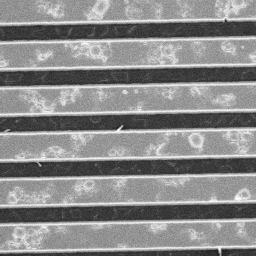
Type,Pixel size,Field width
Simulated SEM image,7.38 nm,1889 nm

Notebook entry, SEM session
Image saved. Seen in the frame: parallel lines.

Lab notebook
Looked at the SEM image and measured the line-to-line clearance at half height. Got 17.1 px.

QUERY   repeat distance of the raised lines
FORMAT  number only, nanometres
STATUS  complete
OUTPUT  336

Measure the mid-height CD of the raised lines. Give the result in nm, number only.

210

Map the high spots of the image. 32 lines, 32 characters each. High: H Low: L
HHHHHHHHHHHHHHHHHHHHHHHHHHHHHHHH
HHHHHHHHHHHHHHHHHHHHHHHHHHHHHHHH
HHHHHHHHHHHHHHHHHHHHHHHHHHHHHHLL
LLLLLLLLLLLLLLLLLLLLLLLLLLLLLLLL
LLLLLLLLLLLLLLLLLLLLLLLLLLLLLLLL
HHHHHHHHHHHHHHHHHHHHHHHHHHHHHHHH
HHHHHHHHHHHHHHHHHHHHHHHHHHHHHHHH
HHHHHHHHHHHHHHHHHHHHHHHHHHHHHHHH
HHHHHHHHHHHHHHLLLLLLLLLLLLLLLLLL
LLLLLLLLLLLLLLLLLLLLLLLLLLLLLLLL
LLLLLLLLLLLLLLLLLLLLLHHHHLHHHHHH
HHHHHHHHHHHHHHHHHHHHHHHHHHHHHHHH
HHHHHHHHHHHHHHHHHHHHHHHHHHHHHHHH
HHHHHHHHHHHHHHHHHHHHHHHHHHHHHHHH
LLLLLLLLLLLLLLLLLLLLLLLLLLLLLLLL
LLLLLLLLLLLLLLLLLLLLLLLLLLLLLLLL
LLLLLLLLLLLHHHHHHHHHHHHHHHHHHHHH
HHHHHHHHHHHHHHHHHHHHHHHHHHHHHHHH
HHHHHHHHHHHHHHHHHHHHHHHHHHHHHHHH
HHHHHHHHHHHHHHHHHHHHHHHHHHHHHHHH
LLLLLLLLLLLLLLLLLLLLLLLLLLLLLLLL
LLLLLLLLLLLLLLLLLLLLLLLLLLLLLLLL
HHHHHHHHHHHHHHHHHHHHHHHHHHHHHHHH
HHHHHHHHHHHHHHHHHHHHHHHHHHHHHHHH
HHHHHHHHHHHHHHHHHHHHHHHHHHHHHHHH
HHHHHHHHHHHHHHHHHHLLLLLLLLLLLLLL
LLLLLLLLLLLLLLLLLLLLLLLLLLLLLLLL
LLLLLLLLLLLLLLLLLLLLLLLLLLLLLLLH
HHHHHHHHHHHHHHHHHHHHHHHHHHHHHHHH
HHHHHHHHHHHHHHHHHHHHHHHHHHHHHHHH
HHHHHHHHHHHHHHHHHHHHHHHHHHHHHHHH
HHLLLLLLLLLLLLLLLLLLLLLLLLLLLLLL